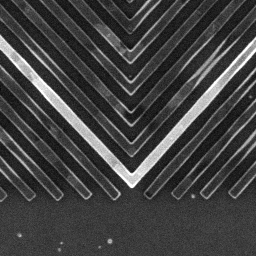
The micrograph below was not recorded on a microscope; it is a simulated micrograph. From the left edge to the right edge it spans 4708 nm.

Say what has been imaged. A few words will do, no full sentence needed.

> groups of lines, slits or small figures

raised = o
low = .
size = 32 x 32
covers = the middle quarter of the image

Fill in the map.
..oooo....ooo.......oooo...ooo..
...oooo....ooo......ooo...ooo...
....oooo....ooo....ooo...oooo...
o....ooo....ooo...ooo....ooo....
oo....ooo....ooooooo....ooo....o
ooo....ooo.....oooo....ooo....oo
.ooo....ooo....ooo....ooo....ooo
..ooo....ooo.........ooo....ooo.
...ooo....ooo.......ooo....ooo..
....ooo....ooo.....ooo....ooo...
o....ooo....ooo...ooo....oooo...
oo....ooo....ooo.oooo....ooo....
ooo....ooo....oooooo....ooo....o
ooo.....ooo....oooo....ooo....oo
.oooo....ooo....oo....ooo....ooo
..ooo.....oo.........ooo....ooo.
...ooo....ooo.......ooo....ooo..
....ooo....oooo....ooo....ooo...
o....ooo....ooo...ooo....ooo....
oo....ooo....ooo..oo....ooo....o
ooo....ooo....ooooo.....oo....oo
.ooo....ooo....oooo...oooo....oo
..ooo....ooo....oo....ooo....ooo
...ooo....ooo........ooo....ooo.
....ooo....ooo......ooo....ooo..
.....ooo....ooo....ooo....ooo...
o....ooo....oooo..ooo....ooo....
oo.....oo.....oooooo....ooo....o
ooo.....oo.....oooo....ooo....oo
.ooo....ooo.....oo....oooo...ooo
..ooo....ooo..........ooo...oooo
...ooo....ooo........ooo....ooo.